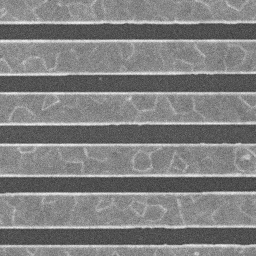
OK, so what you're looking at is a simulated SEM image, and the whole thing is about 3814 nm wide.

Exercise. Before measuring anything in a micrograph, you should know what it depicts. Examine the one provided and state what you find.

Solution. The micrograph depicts lines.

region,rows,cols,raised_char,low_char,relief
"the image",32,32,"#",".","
################################
################################
################################
................................
................................
################################
################################
################################
################################
................................
................................
................................
################################
################################
################################
############....................
................................
................................
################################
################################
################################
################################
................................
................................
################################
################################
################################
################################
................................
................................
................................
################################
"